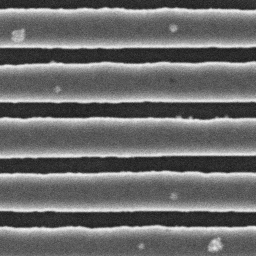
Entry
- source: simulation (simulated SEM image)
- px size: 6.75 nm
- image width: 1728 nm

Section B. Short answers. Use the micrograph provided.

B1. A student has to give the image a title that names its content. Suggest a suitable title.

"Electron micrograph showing lines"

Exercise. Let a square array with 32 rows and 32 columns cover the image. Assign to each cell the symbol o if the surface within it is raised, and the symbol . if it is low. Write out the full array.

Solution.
................................
oooooooooooooooooooooooooooooooo
oooooooooooooooooooooooooooooooo
oooooooooooooooooooooooooooooooo
oooooooooooooooooooooooooooooooo
oooooooooooooooooooooooooooooooo
................................
................................
oooooooooooooooooooooooooooooooo
oooooooooooooooooooooooooooooooo
oooooooooooooooooooooooooooooooo
oooooooooooooooooooooooooooooooo
oooooooooooooooooooooooooooooooo
................................
................................
oooooooooooooooooooooooooooooooo
oooooooooooooooooooooooooooooooo
oooooooooooooooooooooooooooooooo
oooooooooooooooooooooooooooooooo
ooooooooooooooooooooo...........
................................
....................o...........
oooooooooooooooooooooooooooooooo
oooooooooooooooooooooooooooooooo
oooooooooooooooooooooooooooooooo
oooooooooooooooooooooooooooooooo
................................
................................
oo..o..oooo...oooooooooooooooooo
oooooooooooooooooooooooooooooooo
oooooooooooooooooooooooooooooooo
oooooooooooooooooooooooooooooooo